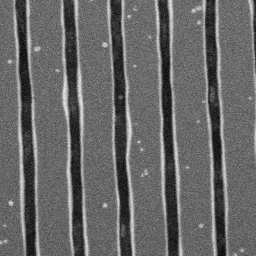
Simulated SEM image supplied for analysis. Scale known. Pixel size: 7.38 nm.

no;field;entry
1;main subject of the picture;parallel lines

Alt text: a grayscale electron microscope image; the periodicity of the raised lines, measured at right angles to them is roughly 0.348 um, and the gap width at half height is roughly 90.3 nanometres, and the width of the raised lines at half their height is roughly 260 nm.